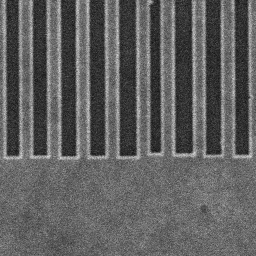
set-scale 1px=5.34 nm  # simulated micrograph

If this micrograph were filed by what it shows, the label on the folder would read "parallel lines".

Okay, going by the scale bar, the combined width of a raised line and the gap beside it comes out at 154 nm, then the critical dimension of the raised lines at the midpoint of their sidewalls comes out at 60.4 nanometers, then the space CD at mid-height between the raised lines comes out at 95.4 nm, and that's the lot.